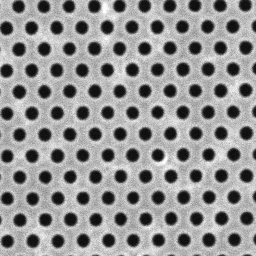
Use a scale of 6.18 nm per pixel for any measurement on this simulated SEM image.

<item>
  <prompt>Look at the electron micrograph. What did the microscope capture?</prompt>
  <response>a regular array of holes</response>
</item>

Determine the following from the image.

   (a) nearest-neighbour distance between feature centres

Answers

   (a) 152 nm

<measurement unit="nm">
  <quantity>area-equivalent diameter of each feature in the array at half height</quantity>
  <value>83.7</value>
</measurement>